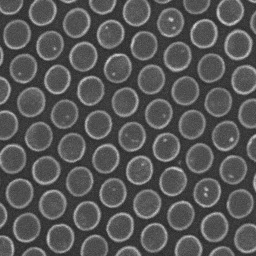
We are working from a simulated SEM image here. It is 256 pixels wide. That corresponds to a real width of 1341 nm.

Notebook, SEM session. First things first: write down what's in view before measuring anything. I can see a regular array of raised bodies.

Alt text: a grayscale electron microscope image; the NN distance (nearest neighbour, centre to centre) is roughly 0.18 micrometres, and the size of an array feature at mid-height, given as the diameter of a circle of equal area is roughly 0.144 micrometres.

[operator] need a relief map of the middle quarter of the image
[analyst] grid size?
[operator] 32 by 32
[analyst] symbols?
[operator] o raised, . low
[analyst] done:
..ooooo...ooooooo....oo...ooooo.
o...oo....ooooooo...oooo...oo...
o.........ooooooo..oooooo.......
o....ooo...ooooo...oooooo....ooo
o...ooooo...oo.....oooooo...oooo
o...oooooo.........oooooo..ooooo
....oooooo....ooo..ooooo...ooooo
....oooooo...ooooo.........ooooo
....ooooo...oooooo..........oooo
oo...ooo....oooooo....oooo..oooo
ooo.........oooooo...oooooo.....
ooo..........ooooo...oooooo.....
ooo....oooo...ooo...ooooooo...oo
ooo...ooooo..........oooooo..ooo
ooo..ooooooo.........ooooo...ooo
oo...ooooooo...oooo...ooo....ooo
......oooooo..oooooo.........ooo
.oo...ooooo...oooooo....ooo...oo
ooooo..oo.....oooooo...ooooo...o
ooooo.........oooooo...oooooo...
ooooo....ooo...oooo...ooooooo...
ooooo...ooooo...oo....ooooooo...
ooooo...oooooo.........ooooo...o
oooo...ooooooo....ooo..oooo....o
.......oooooo....ooooo.........o
........ooooo...oooooo.........o
..oooo..oooo....oooooo....ooo...
.oooooo.........oooooo...ooooo..
.oooooo.........oooooo..ooooooo.
.oooooo...ooooo..ooo....ooooooo.
.oooooo...ooooo.........oooooo..
.ooooo...oooooo.........oooooo..